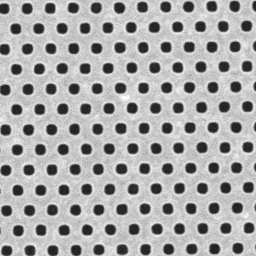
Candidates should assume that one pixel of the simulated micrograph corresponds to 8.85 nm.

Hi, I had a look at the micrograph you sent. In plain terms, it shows a regular array of holes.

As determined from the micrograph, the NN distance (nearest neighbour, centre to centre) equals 22.6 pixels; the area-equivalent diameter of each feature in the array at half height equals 12.4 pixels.